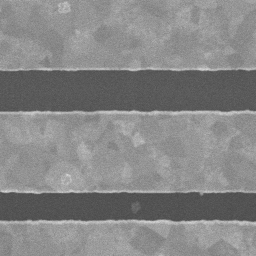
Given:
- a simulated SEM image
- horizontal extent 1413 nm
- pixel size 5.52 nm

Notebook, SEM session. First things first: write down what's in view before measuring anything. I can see lines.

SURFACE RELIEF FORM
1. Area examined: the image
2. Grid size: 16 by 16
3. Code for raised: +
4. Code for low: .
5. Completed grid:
++++++++++++++++
++++++++++++++++
++++++++++++++++
++++++++++++++++
................
................
................
++++++++++++++++
++++++++++++++++
++++++++++++++++
++++++++++++++++
++++++++++++++++
................
................
++++++++++++++++
++++++++++++++++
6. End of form